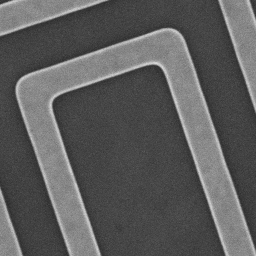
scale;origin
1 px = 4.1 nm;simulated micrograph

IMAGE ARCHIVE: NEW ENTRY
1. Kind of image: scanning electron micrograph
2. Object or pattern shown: groups of lines, slits or small figures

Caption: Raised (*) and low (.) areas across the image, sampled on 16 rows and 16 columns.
*****.........**
**............**
........***....*
.....*******...*
..******..**...*
.****......**...
.**........**...
..*........**...
..**........**..
..**........**..
...*........**..
...**........**.
...**........**.
*...*........**.
*...**........**
*...**........**